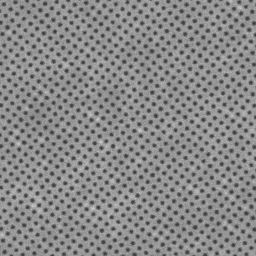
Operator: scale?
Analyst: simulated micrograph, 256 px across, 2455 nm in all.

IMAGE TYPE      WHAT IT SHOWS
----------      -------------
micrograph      a regular array of holes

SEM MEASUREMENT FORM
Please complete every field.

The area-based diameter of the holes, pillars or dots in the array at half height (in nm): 43.3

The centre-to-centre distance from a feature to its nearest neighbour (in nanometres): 76.9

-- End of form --